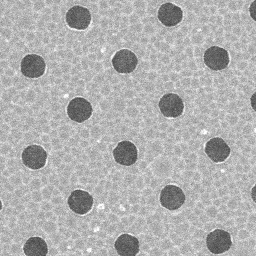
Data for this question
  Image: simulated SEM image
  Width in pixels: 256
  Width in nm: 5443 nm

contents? a regular array of holes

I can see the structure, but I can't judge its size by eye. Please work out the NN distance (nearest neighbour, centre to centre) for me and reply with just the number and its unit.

1360 nm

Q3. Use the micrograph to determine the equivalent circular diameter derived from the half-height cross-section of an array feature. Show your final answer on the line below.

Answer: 546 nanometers